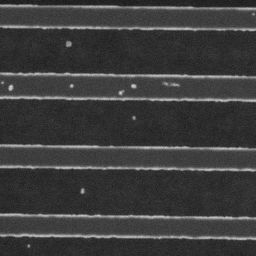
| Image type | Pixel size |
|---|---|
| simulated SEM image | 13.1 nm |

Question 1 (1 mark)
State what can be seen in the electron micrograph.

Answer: lines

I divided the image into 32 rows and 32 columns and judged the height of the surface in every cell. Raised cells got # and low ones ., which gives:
................................
################################
################################
.....###########################
................................
................................
................................
................................
................................
########################........
################################
################################
...................#############
................................
................................
................................
................................
................................
########################........
################################
################################
................................
................................
................................
................................
................................
................................
################################
################################
################################
................................
................................